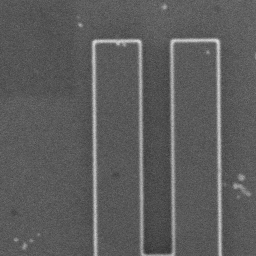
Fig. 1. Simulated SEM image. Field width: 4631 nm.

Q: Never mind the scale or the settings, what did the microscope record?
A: groups of lines, slits or small figures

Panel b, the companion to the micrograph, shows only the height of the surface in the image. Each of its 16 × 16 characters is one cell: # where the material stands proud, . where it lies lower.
................
................
................
......###..###..
......###..###..
......###..###..
......###..###..
......###..###..
......###..###..
......###..###..
......###..###..
......###..###..
......###..###..
......###..###..
......###..###..
......###..###..